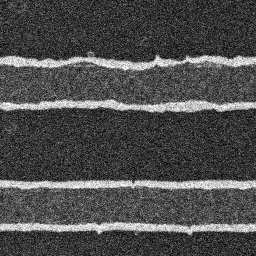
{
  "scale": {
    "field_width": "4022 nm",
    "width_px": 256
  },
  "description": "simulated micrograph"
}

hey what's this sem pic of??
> one or a few lines or trenches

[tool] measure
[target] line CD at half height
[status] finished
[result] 0.709 microns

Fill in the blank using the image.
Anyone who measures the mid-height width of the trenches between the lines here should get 1200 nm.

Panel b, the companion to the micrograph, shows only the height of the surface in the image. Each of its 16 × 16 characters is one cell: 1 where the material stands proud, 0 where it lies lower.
0000000000000000
0000000000000000
0000000000000000
0000000000000000
1111111111111111
1111111111111111
1111111111111111
0000000000000000
0000000000000000
0000000000000000
0000000000000000
1000001111001100
1111111111111111
1111111111111111
0000000000000000
0000000000000000